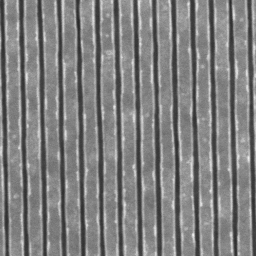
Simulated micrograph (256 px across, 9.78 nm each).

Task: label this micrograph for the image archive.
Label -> parallel lines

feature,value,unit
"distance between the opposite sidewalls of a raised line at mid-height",0.133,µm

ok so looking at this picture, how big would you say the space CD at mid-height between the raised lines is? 58.7 nm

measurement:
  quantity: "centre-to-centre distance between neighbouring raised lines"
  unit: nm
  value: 186